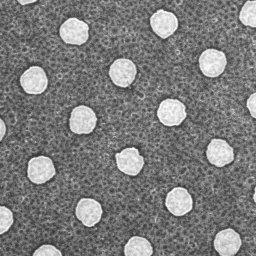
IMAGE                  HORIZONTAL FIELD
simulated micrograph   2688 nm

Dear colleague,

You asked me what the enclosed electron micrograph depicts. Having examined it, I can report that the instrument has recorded a regular array of raised bodies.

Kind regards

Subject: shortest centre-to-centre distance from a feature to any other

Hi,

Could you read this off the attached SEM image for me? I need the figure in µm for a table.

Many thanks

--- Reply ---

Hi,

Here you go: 0.66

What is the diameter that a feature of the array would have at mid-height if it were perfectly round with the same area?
281 nm